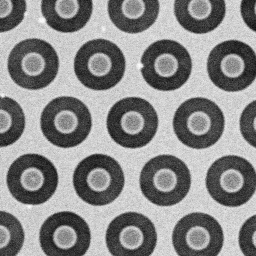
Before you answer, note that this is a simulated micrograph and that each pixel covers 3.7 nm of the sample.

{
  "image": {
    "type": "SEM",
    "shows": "an array of small figures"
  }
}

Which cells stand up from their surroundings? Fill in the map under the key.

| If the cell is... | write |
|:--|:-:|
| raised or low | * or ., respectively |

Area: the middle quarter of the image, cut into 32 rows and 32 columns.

**....*****....*****...*****....
**.....****....****....*****....
***.....**.....****.....***.....
***............*****...........*
****..........******..........**
*****........********........***
*******....*************....****
********************************
...************....*************
.....********........*********..
......******..........*******...
......*****............*****....
**.....****.....***....*****....
***....****....****.....***....*
***....***.....*****....***....*
***....***.....*****....***....*
**.....****....****....****.....
......*****............*****....
......******..........******....
.....********.........*******...
...***********......***********.
********************************
*******..****************.******
*****.......**********.......***
****.........********.........**
***...........******...........*
**......**.....****.....**.....*
**....*****....****....****.....
**....*****....****....*****....
**....*****....****....*****....
**....*****....****....*****....
***.....**.....****.....**.....*